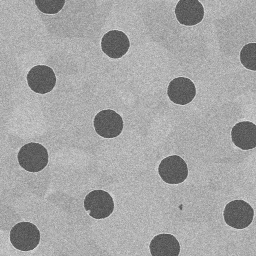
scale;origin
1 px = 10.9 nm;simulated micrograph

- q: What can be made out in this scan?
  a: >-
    a regular array of holes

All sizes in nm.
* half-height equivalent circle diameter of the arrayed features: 328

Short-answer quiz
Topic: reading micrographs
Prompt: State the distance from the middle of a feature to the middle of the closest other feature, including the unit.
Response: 0.869 µm